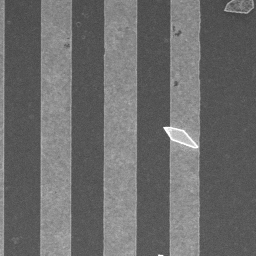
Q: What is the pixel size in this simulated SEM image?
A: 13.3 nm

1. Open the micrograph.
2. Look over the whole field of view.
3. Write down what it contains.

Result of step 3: one or a few lines or trenches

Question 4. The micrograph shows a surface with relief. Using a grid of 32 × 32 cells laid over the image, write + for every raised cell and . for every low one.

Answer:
.....++++....++++....++++....+++
.....++++....++++....++++.....+.
.....++++....++++.....+++.......
.....++++....++++.....+++.......
.....++++....++++......++.......
.....+++.....++++....++++.......
.....++++....++++....++++.......
.....++++....++++....++++.......
.....++++....++++....++++.......
.....++++....++++.....+++.......
.....++++....++++.....+++.......
.....++++....++++....++++.......
.....++++....++++....++++.......
.....++++....++++....++++.......
.....++++....++++....++++.......
.....++++....++++....++++.......
.....++++....++++....++++.......
.....++++....++++....++++.......
.....++++....++++....++++.......
.....++++....++++....++++.......
.....++++....++++....++++.......
.....++++....++++....++++.......
.....++++....++++....++++.......
.....++++....++++....++++.......
.....++++....++++....++++.......
.....++++....++++....++++.......
.....++++....++++....++++.......
.....++++....++++....++++.......
.....++++....++++....++++.......
.....++++....++++....++++.......
.....++++....++++....++++.......
.....++++....++++....++++.......